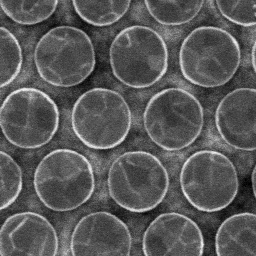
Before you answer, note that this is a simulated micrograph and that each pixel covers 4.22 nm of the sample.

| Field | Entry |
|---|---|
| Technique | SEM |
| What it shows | a regular array of raised bodies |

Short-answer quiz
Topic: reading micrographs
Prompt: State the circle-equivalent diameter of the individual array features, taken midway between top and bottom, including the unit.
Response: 252 nm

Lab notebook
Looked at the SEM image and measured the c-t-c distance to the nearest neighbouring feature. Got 302 nm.